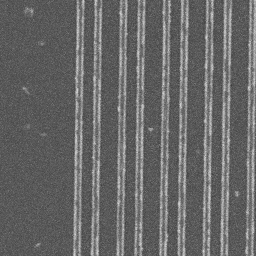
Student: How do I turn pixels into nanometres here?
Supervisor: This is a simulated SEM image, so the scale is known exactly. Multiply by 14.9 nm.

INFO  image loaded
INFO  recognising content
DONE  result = parallel lines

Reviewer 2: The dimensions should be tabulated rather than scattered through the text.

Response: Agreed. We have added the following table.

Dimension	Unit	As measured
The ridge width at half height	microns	0.0987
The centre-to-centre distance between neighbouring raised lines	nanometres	320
